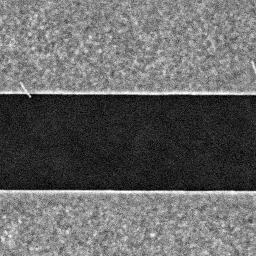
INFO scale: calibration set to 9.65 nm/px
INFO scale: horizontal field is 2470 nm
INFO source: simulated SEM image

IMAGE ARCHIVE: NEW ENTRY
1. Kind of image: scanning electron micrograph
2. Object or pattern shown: wiring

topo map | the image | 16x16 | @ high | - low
@@@@@@@@@@@@@@@@
@@@@@@@@@@@@@@@@
@@@@@@@@@@@@@@@@
@@@@@@@@@@@@@@@@
@@@@@@@@@@@@@@@@
@@@@@@@@@@@@@@@@
----------------
----------------
----------------
----------------
----------------
----------------
@@@@@@@@@@@@@@@@
@@@@@@@@@@@@@@@@
@@@@@@@@@@@@@@@@
@@@@@@@@@@@@@@@@